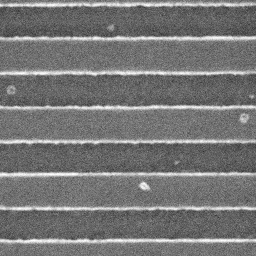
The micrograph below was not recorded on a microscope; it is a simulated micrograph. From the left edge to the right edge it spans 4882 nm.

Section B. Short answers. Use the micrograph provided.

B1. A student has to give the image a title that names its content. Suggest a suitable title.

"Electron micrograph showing lines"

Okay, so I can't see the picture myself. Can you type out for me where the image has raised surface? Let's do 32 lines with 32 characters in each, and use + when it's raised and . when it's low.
++++++++++++++++++++++++++++++++
................................
................................
................................
................................
++++++++++++++++++++++++++++++++
++++++++++++++++++++++++++++++++
++++++++++++++++++++++++++++++++
++++++++++++++++++++++++++++++++
................................
................................
................................
................................
++++++++++++++++++++++++++++++++
++++++++++++++++++++++++++++++++
++++++++++++++++++++++++++++++++
++++++++++++++++++++++++++++++++
++++++++++++++++++++++++++++++++
................................
................................
................................
................................
++++++++++++++++++++++++++++++++
++++++++++++++++++++++++++++++++
++++++++++++++++++++++++++++++++
++++++++++++++++++++++++++++++++
................................
................................
................................
................................
++++++++++++++++++++++++++++++++
++++++++++++++++++++++++++++++++